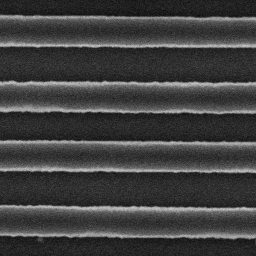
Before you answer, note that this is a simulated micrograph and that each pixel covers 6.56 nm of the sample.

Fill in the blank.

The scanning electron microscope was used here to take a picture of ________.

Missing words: lines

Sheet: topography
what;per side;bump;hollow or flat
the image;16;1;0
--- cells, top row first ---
0000000000000000
1111111111111111
1111111111111111
0000000000000000
0000000000000000
1111111111111111
1111111111111111
0000000000000000
0000000000000000
1111111111111111
1111111111111111
0000000000000000
0000000000000000
1111111111111111
1111111111111111
0000000000000000